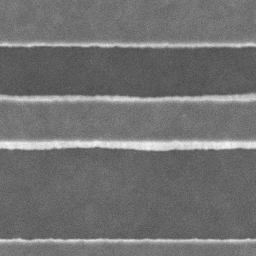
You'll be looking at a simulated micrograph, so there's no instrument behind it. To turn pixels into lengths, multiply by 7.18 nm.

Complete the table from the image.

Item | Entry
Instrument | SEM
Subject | lines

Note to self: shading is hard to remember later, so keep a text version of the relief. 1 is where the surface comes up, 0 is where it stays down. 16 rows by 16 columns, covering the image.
1111111111111111
1111111111111111
1111111111111111
0000000000000000
0000000000000000
0000000000000000
1111111111111111
1111111111111111
1111111111111111
0000000000000000
0000000000000000
0000000000000000
0000000000000000
0000000000000000
0000000000000000
1111111111111111